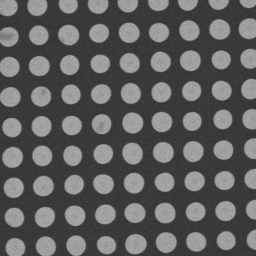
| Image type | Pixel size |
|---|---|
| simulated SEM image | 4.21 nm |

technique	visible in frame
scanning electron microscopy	an array of small figures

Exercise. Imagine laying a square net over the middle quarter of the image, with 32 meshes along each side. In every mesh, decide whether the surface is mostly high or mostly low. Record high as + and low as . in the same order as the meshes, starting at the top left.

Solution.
++++...++++...+++++...++++...+++
+++....++++....+++.....+++.....+
.+..............................
................................
................................
.++.....+++....+++....++++....++
++++...+++++..+++++...+++++...++
++++...+++++..+++++...+++++...++
++++...++++....++++...++++....++
+++.....++.....+++..............
................................
................................
................++.....+++.....+
+++.....+++....++++...+++++...++
++++...+++++...+++++..+++++...++
++++...+++++...+++++..+++++...++
++++....+++....++++....+++.....+
.++.............................
................................
...............................+
.........++....++++....++++...++
++++....++++...++++...+++++...++
++++....++++...+++++..+++++...++
++++....++++...++++....++++...++
++++....+++.....+++.....++......
................................
................................
................+++.....++.....+
.+++....++++...+++++...++++...++
+++++..+++++...+++++...++++...++
+++++..+++++...+++++...++++...++
++++....++++....+++.....++.....+